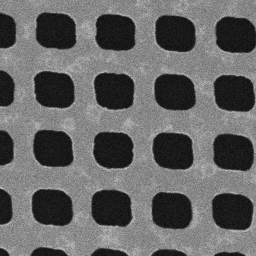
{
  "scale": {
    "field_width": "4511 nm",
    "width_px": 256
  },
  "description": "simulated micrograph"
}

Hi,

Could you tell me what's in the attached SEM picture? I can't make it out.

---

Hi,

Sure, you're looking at a regular array of holes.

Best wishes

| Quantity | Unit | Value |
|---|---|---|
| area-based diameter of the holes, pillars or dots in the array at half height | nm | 716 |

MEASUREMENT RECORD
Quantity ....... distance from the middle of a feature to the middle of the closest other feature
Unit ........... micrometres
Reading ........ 1.04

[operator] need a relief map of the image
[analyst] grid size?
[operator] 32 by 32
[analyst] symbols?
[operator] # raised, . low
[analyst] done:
################################
################################
..###....###....####....###....#
..##......##.....##.....###.....
..##......##.....##.....###.....
..###....###.....###....###.....
############################...#
################################
################################
.###.....###....####...#####..##
..##.....###.....##.....###.....
..##.....###.....##.....###.....
..###....###.....##.....###.....
#############...####....###....#
################################
################################
.####...#####.##################
..##.....###....###.....###....#
..##.....###.....##.....###.....
..##.....###.....##.....###.....
.####....###....####....###.....
################################
################################
################################
.###.....###....###....####....#
.###.....##.....###.....###.....
..##.....##.....###.....##......
.####....###....###.....###.....
#####################..#####...#
################################
################################
.###....####...####....#########